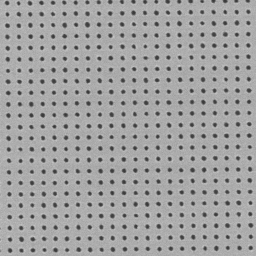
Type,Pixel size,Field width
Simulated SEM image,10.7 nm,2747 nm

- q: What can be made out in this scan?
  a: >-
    a regular array of holes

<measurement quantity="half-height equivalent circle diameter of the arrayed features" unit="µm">0.0484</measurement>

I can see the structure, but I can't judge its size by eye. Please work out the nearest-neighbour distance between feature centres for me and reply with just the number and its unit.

119 nm